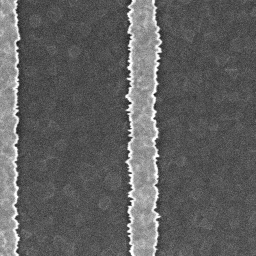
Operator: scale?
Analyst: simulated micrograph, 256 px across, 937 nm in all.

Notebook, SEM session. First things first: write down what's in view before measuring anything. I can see one or a few lines or trenches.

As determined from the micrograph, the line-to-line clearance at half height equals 416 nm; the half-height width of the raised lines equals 0.0962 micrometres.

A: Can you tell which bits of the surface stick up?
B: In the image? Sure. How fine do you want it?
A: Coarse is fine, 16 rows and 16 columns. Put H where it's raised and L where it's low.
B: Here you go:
HLLLLLLLHHLLLLLL
HLLLLLLLHHLLLLLL
HLLLLLLLHHLLLLLL
HLLLLLLLHHLLLLLL
HLLLLLLLHHLLLLLL
HLLLLLLLHHLLLLLL
HLLLLLLLHHLLLLLL
HLLLLLLLHHLLLLLL
HLLLLLLLHHLLLLLL
HLLLLLLLHHLLLLLL
HLLLLLLLHHLLLLLL
HLLLLLLLHHLLLLLL
HLLLLLLLHHLLLLLL
HLLLLLLLHHLLLLLL
HLLLLLLLHHLLLLLL
HLLLLLLLHHLLLLLL